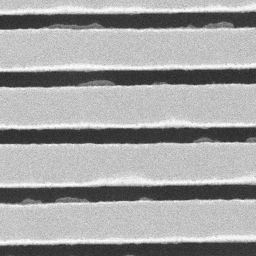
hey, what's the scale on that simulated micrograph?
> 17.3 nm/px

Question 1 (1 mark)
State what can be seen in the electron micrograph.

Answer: lines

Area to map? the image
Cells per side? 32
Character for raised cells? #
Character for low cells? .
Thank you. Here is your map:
################################
##################..............
................................
...............................#
################################
################################
################################
################################
################################
................................
................................
################################
################################
################################
################################
################################
................................
................................
################################
################################
################################
################################
################################
................................
................................
......##########################
################################
################################
################################
################################
#####...........................
................................